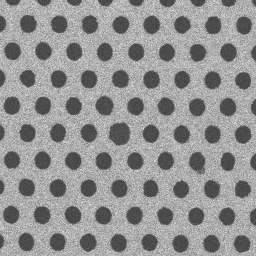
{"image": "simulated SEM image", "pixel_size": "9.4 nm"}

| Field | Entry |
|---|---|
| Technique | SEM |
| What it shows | a regular array of holes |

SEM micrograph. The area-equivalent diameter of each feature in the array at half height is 17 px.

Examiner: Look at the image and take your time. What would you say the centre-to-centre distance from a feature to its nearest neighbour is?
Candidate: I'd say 30.7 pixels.